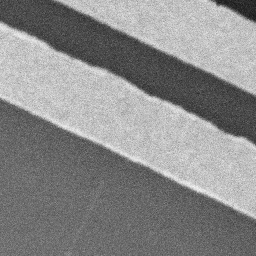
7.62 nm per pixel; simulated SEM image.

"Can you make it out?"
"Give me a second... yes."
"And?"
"one or a few lines or trenches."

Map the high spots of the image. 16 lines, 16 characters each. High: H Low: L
LLLLLHHHHHHHHHLL
LLLLLLLHHHHHHHHH
HHLLLLLLLHHHHHHH
HHHHLLLLLLLHHHHH
HHHHHHLLLLLLLHHH
HHHHHHHHLLLLLLLH
LHHHHHHHHHLLLLLL
LLLHHHHHHHHHHLLL
LLLLLHHHHHHHHHLL
LLLLLLLHHHHHHHHH
LLLLLLLLLLHHHHHH
LLLLLLLLLLLLHHHH
LLLLLLLLLLLLLLHH
LLLLLLLLLLLLLLLL
LLLLLLLLLLLLLLLL
LLLLLLLLLLLLLLLL